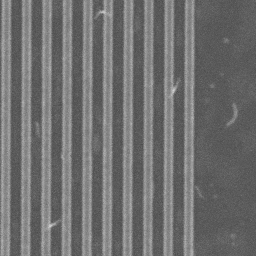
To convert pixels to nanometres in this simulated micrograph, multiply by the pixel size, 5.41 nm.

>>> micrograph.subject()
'parallel lines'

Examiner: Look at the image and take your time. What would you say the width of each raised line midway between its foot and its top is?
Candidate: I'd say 7.01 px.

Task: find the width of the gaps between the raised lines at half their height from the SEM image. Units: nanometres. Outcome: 69.7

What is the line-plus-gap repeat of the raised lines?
0.11 microns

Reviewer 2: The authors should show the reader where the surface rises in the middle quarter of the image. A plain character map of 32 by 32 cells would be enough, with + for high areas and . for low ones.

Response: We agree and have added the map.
++...++...++...++...++....+...++
++...++...++...++...++....+...++
++...++...++...++...++....+...++
++...++...++...++...++...++...++
++...++...++...++...++...++...++
++...++...++...++...++...++...++
++...++...++...++...++...++...++
++...++...++...++...++...++...++
++...++...++...++...++...++...++
++...++...++...++...++...++...++
+....++...++...++...++...++...++
+....++...++...++...++...++...++
+....++...++...++...++...++...++
+....++...++...++...++...++...++
+....++...++...++...++...++...++
+....++...++...++...++...++...++
+....++...++...++...++...++...++
+....++...++...++...++...++...++
+....++...++...++...++...++...++
+....++...++...++...++...++...++
+....++.+.++...++...++...++...++
+....++...++...++...++...++...++
+....++...++...++...++...++...++
+....++...++...++...++...++...++
+....++...++...++...++...++...++
+....++...++...++...++...++...++
+....++...++...++...++...++...++
+....++...++...++...++...++...++
+....++...++...++...++...++...++
+....++...++...++...++...++...++
+....++...++...++...++...++...++
+....++...++...++...++...++...++